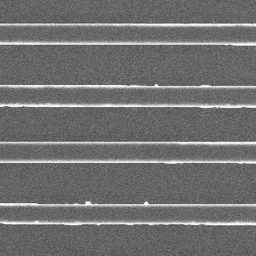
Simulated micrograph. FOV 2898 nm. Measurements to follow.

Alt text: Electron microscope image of lines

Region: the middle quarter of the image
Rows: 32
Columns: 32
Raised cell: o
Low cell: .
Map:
................................
................................
................................
................................
................................
ooooooooooooo...................
oooooooooooooooooooooooooooooooo
oooooooooooooooooooooooooooooooo
oooooooooooooooooooooooooooooooo
oooooooooooooooooooooooooooooooo
oooooooooo.ooooooooooooooooooooo
................................
................................
................................
................................
................................
................................
................................
................................
................................
oooooooooooooooooooooooooooooooo
oooooooooooooooooooooooooooooooo
oooooooooooooooooooooooooooooooo
oooooooooooooooooooooooooooooooo
oooooooooooooooooooooooooooooooo
................................
................................
................................
................................
................................
................................
................................